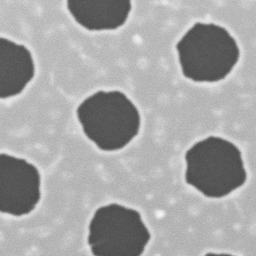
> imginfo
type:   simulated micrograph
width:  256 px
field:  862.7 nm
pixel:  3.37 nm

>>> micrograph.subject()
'holes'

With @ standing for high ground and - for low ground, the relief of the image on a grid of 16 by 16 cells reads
@@@@----@@@@@@@@
@@@@@---@@@@-@@@
-@@@@@@@@@@----@
--@@@@@@@@@----@
--@@@@@@@@@---@@
--@@@@@@@@@@@@@@
@@@@@---@@@@@@@@
@@@@@----@@@@@@@
@@@@@---@@@@@@@@
@@@@@@@@@@@@---@
--@@@@@@@@@@---@
--@@@@@@@@@@---@
--@@@@@@@@@@@@@@
@@@@@@---@@@@@@@
@@@@@@---@@@@@@@
@@@@@@---@@@@@@@